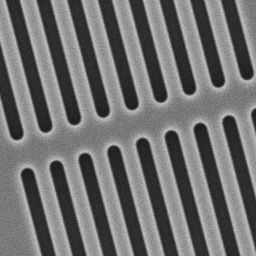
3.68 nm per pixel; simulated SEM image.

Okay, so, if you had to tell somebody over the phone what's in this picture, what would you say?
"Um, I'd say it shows groups of lines, slits or small figures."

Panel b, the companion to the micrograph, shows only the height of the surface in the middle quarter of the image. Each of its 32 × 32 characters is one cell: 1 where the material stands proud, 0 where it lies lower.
01111000011110001111000011110000
01111000011110000111100011110000
00111000011110000111100001111000
00111100001110000111100001111000
00111100001111000111110001111000
00111100001111000011110001111000
00011110001111000011110000111100
00011110001111100011110000111100
00011110000111100011110000111111
00011110000111100001111001111111
00001111000111100001111111111111
00001111000011111111111111111111
00001111000111111111111111111111
10001111101111111111111111111111
10001111111111111111111111111111
11111111111111111111111111111111
11111111111111111111111111111111
11111111111111111111111110001111
11111111111111111110111110000111
11111111111111111100011110000111
11111111111101111100001111000111
11111111111000111100001111000111
11110011111000111100001111000011
11110001111000011110001111000011
11110001111000011110000111100011
11110000111100011110000111100001
11110000111100011110000111100001
11110000111100001111000111100001
01111000111100001111000011110001
01111000011100001111000011110000
01111000011110000111100011110000
01111000011110000111100011111000